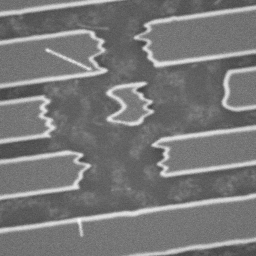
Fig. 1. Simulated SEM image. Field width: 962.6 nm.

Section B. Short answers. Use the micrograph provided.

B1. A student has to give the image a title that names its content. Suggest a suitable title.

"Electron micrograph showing one or a few lines or trenches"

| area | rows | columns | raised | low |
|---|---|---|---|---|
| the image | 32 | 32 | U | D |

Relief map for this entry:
UUUUUUUUUUDDDDDDDDDDDDDDDDDDDDDD
UUUDDDDDDDDDDDDDDDDDDDDDDDDDUUUU
DDDDDDDDDDDDDDDDDDDDUUUUUUUUUUUU
DDDDDDDDDDDDDDDDDDUUUUUUUUUUUUUU
DDDDDDUUUUUUDDDDDUUUUUUUUUUUUUUU
UUUUUUUUUUUUUDDDDDUUUUUUUUUUUUUU
UUUUUUUUUUUUUDDDDDUUUUUUUUUUUUUU
UUUUUUUUUUUUDDDDDDDUUUUUUDDDDDDD
UUUUUUUUUUUUUDDDDDDDDDDDDDDDDDDD
UUUUUUUUUUDDDDDDDDDDDDDDDDDDUUUU
UUUDDDDDDDDDDDDDDDDDDDDDDDDDUUUU
DDDDDDDDDDDDDDUUUDDDDDDDDDDDUUUU
DDDUUUDDDDDDDDDUUUDDDDDDDDDDUUUU
UUUUUUDDDDDDDDDUUUUDDDDDDDDDDUUU
UUUUUUDDDDDDDDUUUUDDDDDDDDDDDDDD
UUUUUUDDDDDDDDDDUDDDDDDDDDDDDDDD
UUUUUUDDDDDDDDDDDDDDDDDDDDDUUUUU
UUDDDDDDDDDDDDDDDDDDUUUUUUUUUUUU
DDDDDDDDDDDDDDDDDDDDUUUUUUUUUUUU
DDDDDUUUUUDDDDDDDDDDDUUUUUUUUUUU
UUUUUUUUUUUDDDDDDDDDUUUUUUUUUUUD
UUUUUUUUUUDDDDDDDDDDUUUUDDDDDDDD
UUUUUUUUUUDDDDDDDDDDDDDDDDDDDDDD
UUUUUUUUUDDDDDDDDDDDDDDDDDDDDDDD
UUUDDDDDDDDDDDDDDDDDDDDDDDDDDDDU
DDDDDDDDDDDDDDDDDDDDDDDDUUUUUUUU
DDDDDDDDDDDDDDDDDUUUUUUUUUUUUUUU
DDDDDDDDDUUUUUUUUUUUUUUUUUUUUUUU
DDUUUUUUUUUUUUUUUUUUUUUUUUUUUUUU
UUUUUUUUUUUUUUUUUUUUUUUUUUUUUUUU
UUUUUUUUUUUUUUUUUUUUUUUUUUUUDDDD
UUUUUUUUUUUUUUUUUUUUUUDDDDDDDDDD